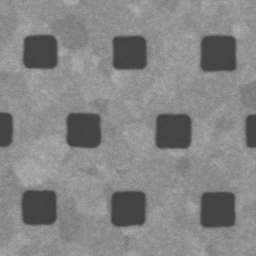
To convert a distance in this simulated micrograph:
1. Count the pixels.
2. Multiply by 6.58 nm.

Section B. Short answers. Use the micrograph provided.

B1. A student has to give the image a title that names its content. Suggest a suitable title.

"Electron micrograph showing a regular array of holes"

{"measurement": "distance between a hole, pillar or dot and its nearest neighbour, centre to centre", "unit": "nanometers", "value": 586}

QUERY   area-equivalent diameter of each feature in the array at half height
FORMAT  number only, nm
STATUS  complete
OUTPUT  255